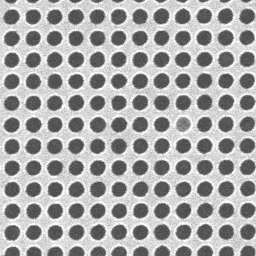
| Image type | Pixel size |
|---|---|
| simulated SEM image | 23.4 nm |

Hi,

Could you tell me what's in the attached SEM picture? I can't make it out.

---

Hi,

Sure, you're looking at a regular array of holes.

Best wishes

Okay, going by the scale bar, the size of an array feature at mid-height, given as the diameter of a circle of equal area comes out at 382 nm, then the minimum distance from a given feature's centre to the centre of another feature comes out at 490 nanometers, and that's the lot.